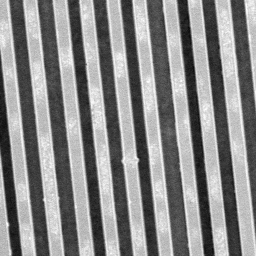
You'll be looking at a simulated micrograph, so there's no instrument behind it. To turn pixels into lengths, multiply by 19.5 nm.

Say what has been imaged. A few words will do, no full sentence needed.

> parallel lines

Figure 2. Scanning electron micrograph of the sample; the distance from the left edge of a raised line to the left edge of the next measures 534 nanometres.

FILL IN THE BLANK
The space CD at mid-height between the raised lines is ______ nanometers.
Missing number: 274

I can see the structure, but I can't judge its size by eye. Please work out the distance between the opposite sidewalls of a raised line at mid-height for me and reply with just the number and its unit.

256 nm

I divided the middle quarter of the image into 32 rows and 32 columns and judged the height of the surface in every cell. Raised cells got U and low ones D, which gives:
UUDDDDUUUDDDDUUUDDDUUUDDDDDUUUDD
UUDDDDUUUDDDDUUUDDDUUUDDDDDUUUDD
UUUDDDUUUDDDDUUUDDDUUUDDDDDUUUDD
UUUDDDUUUDDDDUUUDDDUUUDDDDDUUUDD
UUUDDDUUUDDDDUUUDDDDUUDDDDDUUUDD
UUUDDDUUUDDDDUUUDDDDUUUDDDDUUUDD
UUUDDDUUUDDDDUUUDDDDUUUDDDDUUUDD
UUUDDDUUUDDDDUUUDDDDUUUDDDDUUUUD
UUUDDDUUUUDDDUUUDDDDUUUDDDDUUUUD
UUUDDDDUUUDDDUUUUDDDUUUDDDDDUUUD
UUUDDDDUUUDDDDUUUDDDUUUDDDDDUUUD
UUUUDDDUUUDDDDUUUDDDUUUDDDDDUUUD
UUUUDDDUUUDDDDUUUDDDUUUDDDDDUUUD
DUUUDDDUUUDDDDUUUDDDUUUDDDDDUUUD
DUUUDDDUUUDDDDUUUDDDUUUUDDDDUUUD
DUUUDDDUUUDDDDUUUDDDUUUUDDDDUUUD
DUUUDDDDUUDDDDUUUDDDDUUUDDDDUUUD
DUUUDDDDUUUDDDUUUDDDDUUUDDDDUUUU
DUUUDDDDUUUDDDDUUUDDDUUUDDDDDUUU
DUUUDDDDUUUDDDDUUUDDDUUUDDDDDUUU
DUUUDDDDUUUDDDDUUUDDDUUUDDDDDUUU
DUUUUDDDUUUDDDDUUUDDDUUUDDDDDUUU
DDUUUDDDUUUDDDDUUUDDDUUUDDDDDUUU
DDUUUDDDUUUDDDDUUUDDDDUUDDDDDUUU
DDUUUDDDUUUDDDDUUUDDDDUUUDDDDUUU
DDUUUDDDUUUDDDDUUUDDDDUUUDDDDUUU
DDUUUDDDDUUUDDDUUUDDDDUUUDDDDUUU
DDUUUDDDDUUUDDDUUUDDDDUUUDDDDUUU
DDUUUDDDDUUUDDDUUUUDDDUUUDDDDDUU
DDUUUDDDDUUUDDDDUUUDDDUUUDDDDDUU
DDUUUUDDDUUUDDDDUUUDDDUUUDDDDDUU
DDUUUUDDDUUUDDDDUUUDDDUUUDDDDDUU